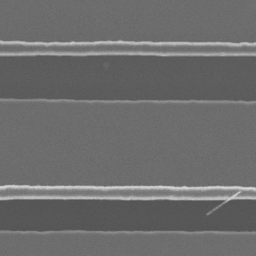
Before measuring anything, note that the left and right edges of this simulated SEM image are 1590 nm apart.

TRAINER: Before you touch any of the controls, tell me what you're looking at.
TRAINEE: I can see lines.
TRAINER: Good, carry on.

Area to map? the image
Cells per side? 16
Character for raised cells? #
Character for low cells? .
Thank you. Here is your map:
################
################
################
................
................
................
################
################
################
################
################
################
................
................
##############..
################